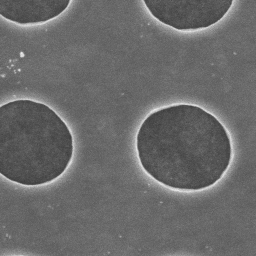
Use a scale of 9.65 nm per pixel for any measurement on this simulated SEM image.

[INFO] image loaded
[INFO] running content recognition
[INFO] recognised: holes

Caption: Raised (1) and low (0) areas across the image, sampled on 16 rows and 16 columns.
0000111110000011
1111111111000111
1111111111111111
1111111111111111
1111111111111111
1111111111111111
0001111111111111
0000111110000011
0000111110000011
0000011110000011
0000111110000011
1001111111000111
1111111111111111
1111111111111111
1111111111111111
1111111111111111